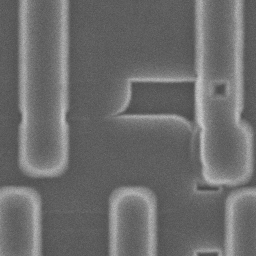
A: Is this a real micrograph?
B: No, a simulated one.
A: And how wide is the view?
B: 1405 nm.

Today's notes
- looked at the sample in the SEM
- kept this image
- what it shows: wiring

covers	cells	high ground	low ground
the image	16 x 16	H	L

LHHHLLLLLLLLHHHL
LHHHLLLLLLLLHHHL
LHHHLLLLLLLLHHHL
LHHHLLLLLLLLHHHL
LHHHLLLLLLLLHHHL
LHHHLLLLLLLLHHHL
LHHHLLLLLLLLHHHL
LHHHLLLLLLLLLHHL
LHHHLLLLLLLLLHHH
LHHHLLLLLLLLLHHH
LLHHLLLLLLLLLHHH
LLLLLLLLLLLLLLLL
HHLLLLLHHLLLLLHH
HHLLLLLHHHLLLLHH
HHLLLLLHHHLLLLHH
HHLLLLLHHHLLLLHH